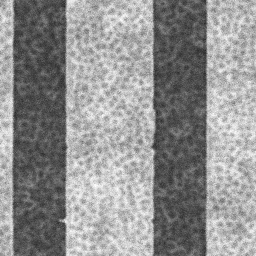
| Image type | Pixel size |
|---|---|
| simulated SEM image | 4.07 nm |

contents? one or a few lines or trenches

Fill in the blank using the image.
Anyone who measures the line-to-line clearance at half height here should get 222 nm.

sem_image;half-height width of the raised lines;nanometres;348